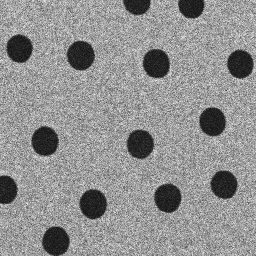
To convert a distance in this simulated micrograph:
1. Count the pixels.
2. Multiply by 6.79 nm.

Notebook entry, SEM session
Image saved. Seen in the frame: a regular array of holes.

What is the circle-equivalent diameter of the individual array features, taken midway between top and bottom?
191 nanometers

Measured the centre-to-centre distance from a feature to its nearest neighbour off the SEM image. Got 0.425 um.